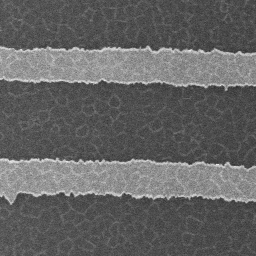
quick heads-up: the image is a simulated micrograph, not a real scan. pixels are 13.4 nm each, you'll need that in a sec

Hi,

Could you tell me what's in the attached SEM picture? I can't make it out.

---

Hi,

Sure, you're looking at one or a few lines or trenches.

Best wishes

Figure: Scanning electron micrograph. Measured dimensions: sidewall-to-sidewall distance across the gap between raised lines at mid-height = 1080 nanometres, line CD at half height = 437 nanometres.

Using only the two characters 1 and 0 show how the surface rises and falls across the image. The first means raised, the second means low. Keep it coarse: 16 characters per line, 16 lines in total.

0000000000000000
0000000000000000
0000000000000000
1111111111111111
1111111111111111
0000000000000000
0000000000000000
0000000000000000
0000000000000000
0000000000000000
1111111111111111
1111111111111111
0000000000000001
0000000000000000
0000000000000000
0000000000000000